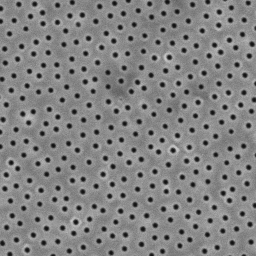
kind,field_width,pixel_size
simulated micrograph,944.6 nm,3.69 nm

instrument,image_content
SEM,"a regular array of holes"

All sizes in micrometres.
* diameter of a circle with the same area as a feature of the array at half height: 0.0186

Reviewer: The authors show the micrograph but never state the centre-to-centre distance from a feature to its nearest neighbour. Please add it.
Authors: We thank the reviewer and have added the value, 47 nm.